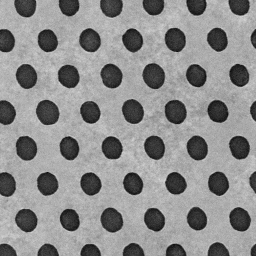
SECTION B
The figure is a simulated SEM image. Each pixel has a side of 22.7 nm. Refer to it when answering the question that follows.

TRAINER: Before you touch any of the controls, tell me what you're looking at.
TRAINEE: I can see a regular array of holes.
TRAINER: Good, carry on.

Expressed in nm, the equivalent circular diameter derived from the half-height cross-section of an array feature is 512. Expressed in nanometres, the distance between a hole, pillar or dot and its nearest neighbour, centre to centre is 945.